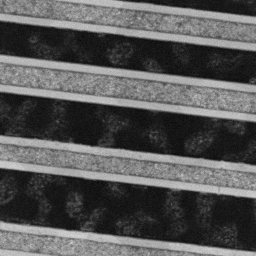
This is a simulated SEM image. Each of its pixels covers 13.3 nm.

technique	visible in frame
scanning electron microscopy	one or a few lines or trenches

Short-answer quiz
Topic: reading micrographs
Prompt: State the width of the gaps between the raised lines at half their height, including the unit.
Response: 663 nanometres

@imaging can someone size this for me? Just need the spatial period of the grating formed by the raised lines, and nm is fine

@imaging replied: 1000